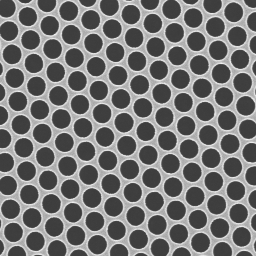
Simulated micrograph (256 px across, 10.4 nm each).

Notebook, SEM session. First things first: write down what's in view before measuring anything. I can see a regular array of holes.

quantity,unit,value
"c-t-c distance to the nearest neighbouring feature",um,0.242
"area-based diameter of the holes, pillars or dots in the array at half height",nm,195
